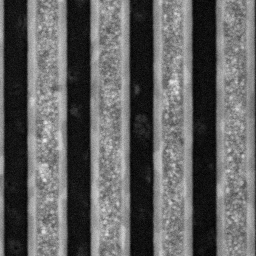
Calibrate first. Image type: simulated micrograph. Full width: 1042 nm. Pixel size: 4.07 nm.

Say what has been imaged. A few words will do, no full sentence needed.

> one or a few lines or trenches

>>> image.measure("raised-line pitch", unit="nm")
255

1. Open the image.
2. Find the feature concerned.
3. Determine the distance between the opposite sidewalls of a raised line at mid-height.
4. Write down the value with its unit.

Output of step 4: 0.128 microns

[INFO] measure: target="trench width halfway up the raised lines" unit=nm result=128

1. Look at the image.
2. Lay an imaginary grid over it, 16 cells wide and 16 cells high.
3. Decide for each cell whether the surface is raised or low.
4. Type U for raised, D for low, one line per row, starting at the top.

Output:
DDUUDDUUDDUUDDUU
DDUUDDUUDDUUDDUU
DDUUDDUUDDUUDDUU
DDUUDDUUDDUUDDUU
DDUUDDUUDDUUDDUU
DDUUDDUUDDUUDDUU
DDUUDDUUDDUUDDUU
DDUUDDUUDDUUDDUU
DDUUDDUUDDUUDDUU
DDUUDDUUDDUUDDUU
DDUUDDUUDDUUDDUU
DDUUDDUUDDUUDDUU
DDUUDDUUDDUUDDUU
DDUUDDUUDDUUDDUU
DDUUDDUUDDUUDDUU
DDUUDDUUDDUUDDUU